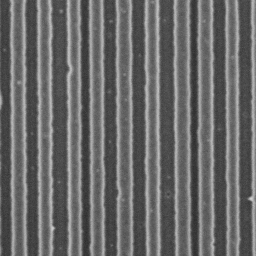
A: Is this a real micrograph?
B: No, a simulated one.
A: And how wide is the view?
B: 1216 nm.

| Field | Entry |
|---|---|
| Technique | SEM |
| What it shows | parallel lines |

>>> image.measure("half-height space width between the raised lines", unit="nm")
66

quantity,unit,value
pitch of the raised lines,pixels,26.8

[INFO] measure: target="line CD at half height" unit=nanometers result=61.8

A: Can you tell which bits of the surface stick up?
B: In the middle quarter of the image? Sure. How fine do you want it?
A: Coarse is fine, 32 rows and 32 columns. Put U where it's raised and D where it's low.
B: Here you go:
DUUUDDDUUUDDDUUUUDDDUUUUDDDDUUUD
DDUUDDDUUUDDDUUUUDDDDUUUDDDDUUUD
DUUUDDDUUUDDDUUUUDDDDUUUDDDDUUUD
DUUUDDDUUUDDDUUUUDDDDUUUDDDDUUUD
DUUUDDDUUUDDDUUUUDDDDUUUDDDDUUUD
DUUUDDDUUUDDDUUUUDDDDUUUDDDDUUUD
DUUUDDDUUUDDDUUUUDDDDUUUDDDDUUUD
DUUUDDDUUUDDDUUUUDDDDUUUDDDDUUUU
DUUUDDDUUUDDDUUUUDDDDUUUDDDDUUUD
DUUUDDDUUUDDDUUUUDDDDUUUDDDDUUUD
DUUUDDDUUUDDDUUUUDDDDUUUDDDDUUUD
DUUUDDDUUUDDDUUUUDDDDUUUDDDDUUUD
DUUUDDDUUUDDDUUUUDDDDUUUDDDDUUUD
DUUUDDDUUUDDDUUUUDDDDUUUDDDDUUUD
DUUUDDDUUUDDDUUUUDDDDUUUDDDDUUUD
DUUUDDDUUUDDDUUUUDDDDUUUDDDDUUUD
DUUUDDDUUUDDDUUUUDDDDUUDDDDDUUUD
DUUUDDDUUUDDDUUUUDDDDUUUDDDDUUUD
DUUUDDDUUUDDDUUUUDDDDUUUDDDDUUUD
DUUUDDDUUUDDDDUUUDDDDUUUDDDDUUUD
DUUUDDDUUUDDDUUUUDDDDUUUDDDDUUUD
DUUUDDDUUUDDDDUUUDDDDUUUDDDDUUUD
DUUUDDDUUUDDDDUUUDDDDUUUDDDDUUUD
DUUUDDDUUUDDDDUUUDDDUUUUDDDDUUUD
DUUUDDDUUUDDDDUUUDDDUUUUDDDDUUUD
DUUUDDDUUUDDDUUUUDDDDUUUDDDDUUUD
DUUUDDDUUUDDDUUUUDDDUUUUDDDDUUUD
DUUUDDDUUUDDDUUUUDDDDUUUDDDDUUUD
DUUUDDDUUUDDDDUUUDDDDUUUDDDDUUUD
DUUUDDDUUUDDDDUUUDDDDUUUDDDDUUUD
DUUUDDDUUUDDDDUUUDDDDUUUDDDDUUUD
DUUUDDDUUUDDDDUUUDDDDUUUDDDDUUUD